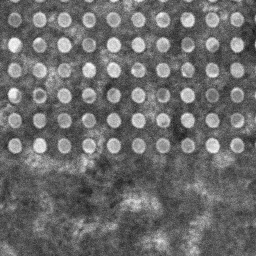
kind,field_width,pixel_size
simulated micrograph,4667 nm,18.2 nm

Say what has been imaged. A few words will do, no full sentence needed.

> a regular array of raised bodies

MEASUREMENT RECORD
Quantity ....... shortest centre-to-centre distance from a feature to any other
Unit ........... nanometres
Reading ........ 448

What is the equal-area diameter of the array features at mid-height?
13.1 pixels